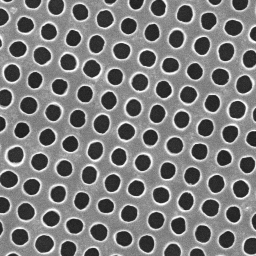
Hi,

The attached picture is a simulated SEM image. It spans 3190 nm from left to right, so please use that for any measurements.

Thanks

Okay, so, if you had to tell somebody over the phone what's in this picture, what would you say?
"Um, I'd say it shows a regular array of holes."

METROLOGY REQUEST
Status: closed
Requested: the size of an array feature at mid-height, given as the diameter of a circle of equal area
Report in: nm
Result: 209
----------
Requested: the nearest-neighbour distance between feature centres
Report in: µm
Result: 0.307